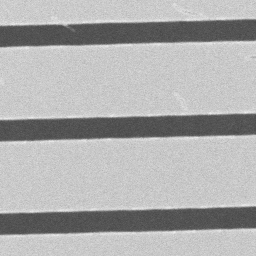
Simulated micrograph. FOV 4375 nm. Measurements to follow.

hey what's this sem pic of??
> lines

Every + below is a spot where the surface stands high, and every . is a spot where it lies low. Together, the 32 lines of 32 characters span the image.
++++++++++++++++++++++++++++++++
++++++++++++++++++++++++++++++++
++++++++++++++++++++++++++......
................................
................................
..................++++++++++++++
++++++++++++++++++++++++++++++++
++++++++++++++++++++++++++++++++
++++++++++++++++++++++++++++++++
++++++++++++++++++++++++++++++++
++++++++++++++++++++++++++++++++
++++++++++++++++++++++++++++++++
++++++++++++++++++++++++++++++++
++++++++++++++++++++++++++++++++
++++++++++++++++................
................................
................................
........++++++++++++++++++++++++
++++++++++++++++++++++++++++++++
++++++++++++++++++++++++++++++++
++++++++++++++++++++++++++++++++
++++++++++++++++++++++++++++++++
++++++++++++++++++++++++++++++++
++++++++++++++++++++++++++++++++
++++++++++++++++++++++++++++++++
++++++++++++++++++++++++++++++++
++++++..........................
................................
................................
++++++++++++++++++++++++++++++++
++++++++++++++++++++++++++++++++
++++++++++++++++++++++++++++++++